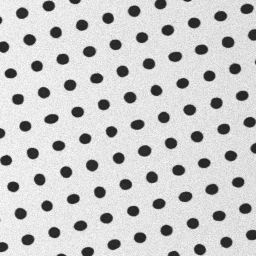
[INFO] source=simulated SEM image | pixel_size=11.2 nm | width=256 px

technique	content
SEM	a regular array of holes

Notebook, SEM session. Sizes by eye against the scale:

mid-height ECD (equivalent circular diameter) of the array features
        0.13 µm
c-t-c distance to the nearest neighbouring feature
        0.302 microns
